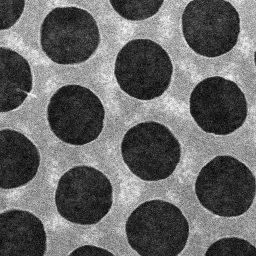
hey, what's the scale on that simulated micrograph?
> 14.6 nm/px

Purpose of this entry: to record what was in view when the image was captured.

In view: holes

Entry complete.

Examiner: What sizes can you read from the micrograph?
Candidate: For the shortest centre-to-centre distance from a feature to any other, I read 1180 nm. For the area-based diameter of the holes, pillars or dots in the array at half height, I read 864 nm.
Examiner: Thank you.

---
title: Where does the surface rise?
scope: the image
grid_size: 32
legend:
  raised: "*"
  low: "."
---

...***********......****.....***
...***.....****.....***.......**
..***.......****..*****.......**
.****.......***********.......**
*****........**********.......**
*****.......****....***......***
..***.......***......***....****
...***.....***.......***********
....**********........**********
....**********.......***********
....***********......****....***
....***.....****....****......**
...***......******.*****.......*
..****.......***********.......*
******.......***********.......*
******.......****...*****.....**
..*****......***.....*****...***
....****....***.......**********
.....**********........*********
.....**********........****..***
.....***********......****....**
.....***.....***......***......*
....***.......****..*****.......
..*****.......**********........
*******.......***********.......
*******.......****....***......*
....***.......***......***.....*
.....***.....***.......*********
.....***********........********
......**********........********
......**********.......***.....*
......***.....***......***......